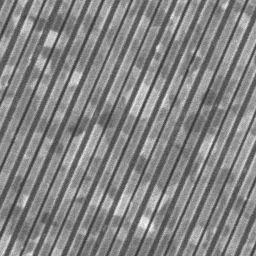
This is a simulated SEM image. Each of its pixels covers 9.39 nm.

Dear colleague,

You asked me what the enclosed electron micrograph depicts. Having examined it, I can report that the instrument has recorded parallel lines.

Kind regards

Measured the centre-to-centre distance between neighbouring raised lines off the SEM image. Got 124 nm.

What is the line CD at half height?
0.0807 microns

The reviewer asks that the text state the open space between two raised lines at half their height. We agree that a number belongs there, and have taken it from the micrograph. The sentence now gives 36.6 nm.